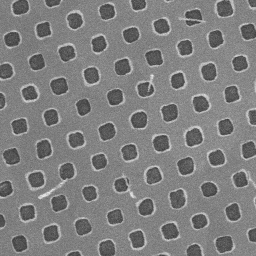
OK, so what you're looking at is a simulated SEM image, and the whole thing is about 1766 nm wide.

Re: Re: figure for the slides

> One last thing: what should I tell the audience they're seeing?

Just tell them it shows a regular array of holes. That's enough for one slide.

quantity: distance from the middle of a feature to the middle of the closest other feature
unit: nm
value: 219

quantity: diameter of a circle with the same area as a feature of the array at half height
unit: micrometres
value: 0.117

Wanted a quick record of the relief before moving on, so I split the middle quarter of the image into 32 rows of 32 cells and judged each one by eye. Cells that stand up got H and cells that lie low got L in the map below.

HHHHHHHHHHHHHLLLLHHHHHHHHHHHHHHH
HHHHHLLLHHHHHLLLLHHHHHHHHHHHHHHH
HHHHHLLLLHHHHLLLHHHHHHHHHHHHLLHH
HHHHHLLLLHHHHHHHHHHHHHHHHHHLLLHH
LHHHHLLLLHHHHHHHHHHLLHHHHHHLLLHH
LHHHHHHHHHHHHHHHHHLLLLHHHHHLLLHH
LHHHHHHHHHHHLLHHHHLLLLLHHHHHHHHH
HHHHHHHHHHHLLLLHHHLLLLHHHHHHHHHH
HHHHHHHHHHHLLLLHHHHHHHHHHHHHHHHH
HHHLLLHHHHHLLLLHHHHHHHHHHHHHHHHH
HHHLLLLHHHHHHHHHHHHHHHHHHLLLHHHH
HHHLLLLHHHHHHHHHHHHHHHHHLLLLHHHH
HHHHLLHHHHHHHHHHHLLLLHHHLLLLHHHH
HHHHHHHHHHHHHHHHHLLLLHHHHLLLHHHH
HHHHHHHHHHHLHHHHHLLLLHHHHHHHHHHH
HHHHHHHHHLLLLHHHHLLLHHHHHHHHHHHH
HHHHHHHHHLLLLHHHHHHHHHHHHHHHHHHH
HLLLLHHHHLLLLHHHHHHHHHHHHHHHHHLL
HLLLLHHHHLLLHHHHHHHHHHHLLLHHHHLL
HLLLLHHHHHHHHHHHHHHHHHLLLLHHHHLL
HLLLLHHHHHHHHHHLLLHHHHLLLLLHHHHL
HHHHHHHHHHHHHHLLLLHHHHHLLLHHHHHH
HHHHHHHHLLHHHHHLLLLHHHHHHHHHHHHH
HHHHHHHLLLLHHHHLLLHHHHHHHHHHHHLL
HHHHHHHLLLLHHHHHHHHHHHHHHHHHLLLL
LLHHHHHLLLHHHHHHHHHHHHHHHHHHLLLL
LLLHHHHHHHHHHHHHHHHHHLLLHHHHHLLL
LLLHHHHHHHHHHHHHHHHHLLLLLHHHHLLL
LLHHHHHHHHHHHHLHHHHHLLLLLHHHHHHH
HHHHHHHHHHHHHLLLHHHHHLLLHHHHHHHH
HHHHHHLHHHHHHLLLHHHHHHHHHHHHHHHH
HHHHHLLLHHHHHLLLHHHHHHHHHHHHLLHH